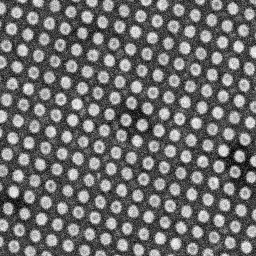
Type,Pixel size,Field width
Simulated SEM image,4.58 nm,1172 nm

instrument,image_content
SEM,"a regular array of raised bodies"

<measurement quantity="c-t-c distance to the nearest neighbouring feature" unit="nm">76.4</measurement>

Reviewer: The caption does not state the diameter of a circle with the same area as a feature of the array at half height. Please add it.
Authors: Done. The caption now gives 43.9 nm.